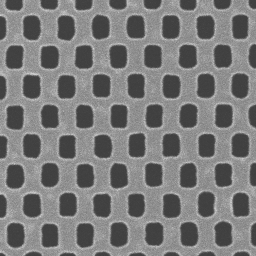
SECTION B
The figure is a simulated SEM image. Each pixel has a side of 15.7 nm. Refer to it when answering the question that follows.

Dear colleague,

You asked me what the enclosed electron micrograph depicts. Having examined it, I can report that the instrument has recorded a regular array of holes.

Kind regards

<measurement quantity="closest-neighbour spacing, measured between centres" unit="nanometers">531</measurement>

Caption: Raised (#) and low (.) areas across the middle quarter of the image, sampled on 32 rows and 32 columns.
###....#####...#####....#####...
################################
########..#######..#############
...####....#####....#####....###
...####.....####....#####....###
...####.....####....#####....###
...####.....####....####.....###
...####....#####....#####....###
..######..#######...######..####
################################
####...#####...######...#####...
###....#####....####.....####...
###.....####....####.....####...
###.....####....####.....####...
###.....####....####.....####...
###....#####....#####...#####...
################################
#################...#####...####
...#####....####....####.....###
...#####....####....####.....###
...#####....####.....###.....###
...####.....####.....####....###
...#####....####....#####....###
...######..#####################
################################
###....#####....####.....####...
###.....####....####.....####...
###.....###.....####.....####...
###.....###.....####.....####...
###.....###.....####.....####...
###....#####...######...#####...
################################